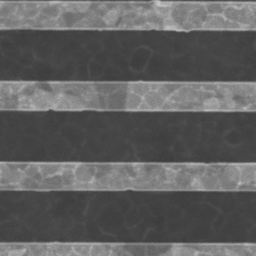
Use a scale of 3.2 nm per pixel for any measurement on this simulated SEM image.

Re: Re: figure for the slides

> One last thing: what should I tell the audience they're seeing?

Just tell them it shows one or a few lines or trenches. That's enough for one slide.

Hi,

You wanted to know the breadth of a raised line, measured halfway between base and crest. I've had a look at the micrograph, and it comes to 0.0856 microns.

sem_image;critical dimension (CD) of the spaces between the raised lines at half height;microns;0.171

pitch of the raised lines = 0.258 um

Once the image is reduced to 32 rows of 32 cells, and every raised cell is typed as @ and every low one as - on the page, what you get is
@@@@@@@@@@@@@@@@@@@@@@@@@@@@@@@@
@@@@@@@@@@@@@@@@@@@@@@@@@@@@@@@@
@@@@@@@@@@@@@@@@@@@@@@@@@@@@@@@@
-----@-@@@@@@@@@@@@@@@@@@@@@@@@@
--------------------------------
--------------------------------
--------------------------------
--------------------------------
--------------------------------
--------------------------------
@@@@@@@@@@@@@@@@@@@@@@@@@@@@@@@@
@@@@@@@@@@@@@@@@@@@@@@@@@@@@@@@@
@@@@@@@@@@@@@@@@@@@@@@@@@@@@@@@@
@@@@@@@@@@@@@@@@@@@@@@@@@@@@@@@@
--------------------------------
--------------------------------
--------------------------------
--------------------------------
--------------------------------
--------------------------------
@@@@@@@@@@@@@@@@@@@@@@@@@-------
@@@@@@@@@@@@@@@@@@@@@@@@@@@@@@@@
@@@@@@@@@@@@@@@@@@@@@@@@@@@@@@@@
@@@@@@@@@@@@@@@@@@@@@@@@@@@@@@@@
--------------------------------
--------------------------------
--------------------------------
--------------------------------
--------------------------------
--------------------------------
------@@--@@@@@@@@@@------------
@@@@@@@@@@@@@@@@@@@@@@@@@@@@@@@@